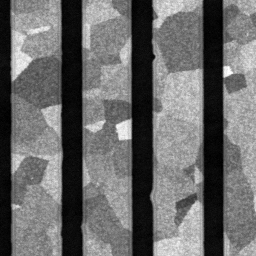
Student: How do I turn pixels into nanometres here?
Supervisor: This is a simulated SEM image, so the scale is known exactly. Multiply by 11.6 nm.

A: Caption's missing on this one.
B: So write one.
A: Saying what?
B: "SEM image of one or a few lines or trenches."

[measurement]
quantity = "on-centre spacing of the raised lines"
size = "818 nm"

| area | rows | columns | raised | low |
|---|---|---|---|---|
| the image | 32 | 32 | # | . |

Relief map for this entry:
..#####...######...######...####
..######..######...######...####
..######..######...######...####
..######..######...######...####
..######..######...######...####
..######..######...######...####
..######..######...######...####
..######..######...######...####
..######..######...######...####
..######..######...######...####
..######..######...######...####
..######..######...######...####
..######..######...######...####
..######..######...######...####
..######..######...######...####
..#####...######...######...####
..#####...######...######...####
..######..######...######...####
..######..######...######...####
..######..######...######...####
..######..######...######...####
..######..######...######...####
..######..######...######...####
..######..######...######...####
..######..######...######...####
..#####...######...######...####
..######..######...######...####
..######..######...######...####
..######..######...######...####
..######..######...######...####
..######..######...######...####
..######..######...######...####